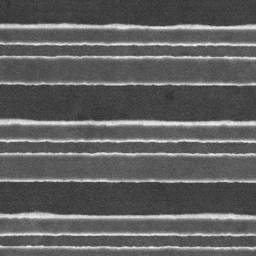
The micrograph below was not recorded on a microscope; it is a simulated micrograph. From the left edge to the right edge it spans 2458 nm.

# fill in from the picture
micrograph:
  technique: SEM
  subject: lines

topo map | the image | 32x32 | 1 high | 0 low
00000000000000000000000000000000
00000000000000000000000000000000
00000000000000000000000000000000
11111111111111111111111111111111
11111111111111111111111111111111
11111111111111111111111111111111
11111111111111111111111111111111
11111111111111111111111111111111
11111111111111111111111111111111
11111111111111111111111111111111
00000000000000010001000001111111
00000000000000000000000000000000
00000000000000000000000000000000
00000000000000000000000000000000
00000000000000000000000000000000
11111111011100011000000000000000
11111111111111111111111111111111
11111111111111111111111111111111
11111111111111111111111111111111
11111111111111111111111111111111
11111111111111111111111111111111
11111111111111111111111111111111
11111111111111111111111111111111
00000000000000000000000000000000
00000000000000000000000000000000
00000000000000000000000000000000
00000000000000000000000000000000
11111111111111111111111111111111
11111111111111111111111111111111
11111111111111111111111111111111
11111111111111111111111111111111
11111111111111111111111111111111